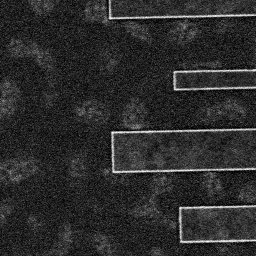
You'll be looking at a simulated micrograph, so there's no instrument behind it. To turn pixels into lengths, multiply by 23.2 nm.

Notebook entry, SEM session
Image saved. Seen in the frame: one or a few lines or trenches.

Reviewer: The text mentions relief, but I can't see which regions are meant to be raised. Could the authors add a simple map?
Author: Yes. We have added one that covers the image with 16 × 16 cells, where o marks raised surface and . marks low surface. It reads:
.......ooooooooo
................
................
................
...........ooooo
...........oooo.
................
................
.......ooooooooo
.......ooooooooo
.......ooooooooo
................
................
...........ooooo
...........ooooo
................